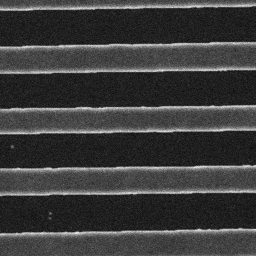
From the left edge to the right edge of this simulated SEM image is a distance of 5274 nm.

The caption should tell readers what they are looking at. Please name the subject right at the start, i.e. lines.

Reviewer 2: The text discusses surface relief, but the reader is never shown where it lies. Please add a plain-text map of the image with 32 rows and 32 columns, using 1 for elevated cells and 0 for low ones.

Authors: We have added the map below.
11111111111111111111111111111111
00000000000000000000000000000000
00000000000000000000000000000000
00000000000000000000000000000000
00000000000000000000000000000000
00000000000000000000011111111111
11111111111111111111111111111111
11111111111111111111111111111111
11111111111111111111111111111111
00000000000000000000000000000000
00000000000000000000000000000000
00000000000000000000000000000000
00000000000000000000000000000000
00000000011101111111111111111111
11111111111111111111111111111111
11111111111111111111111111111111
11111111111110000000000000000000
00000000000000000000000000000000
00000000000000000000000000000000
00000000000000000000000000000000
00000000000000000000000000000000
11111111111111111111111111111111
11111111111111111111111111111111
11111111111111111111111111111111
00000000000000000000000000000000
00000000000000000000000000000000
00000000000000000000000000000000
00000000000000000000000000000000
00000000000000000000000000000000
11111111111111111111111111111111
11111111111111111111111111111111
11111111111111111111111111111111